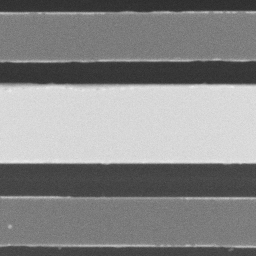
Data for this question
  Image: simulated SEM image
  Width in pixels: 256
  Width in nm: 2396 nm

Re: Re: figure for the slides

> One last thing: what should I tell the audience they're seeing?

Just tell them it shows lines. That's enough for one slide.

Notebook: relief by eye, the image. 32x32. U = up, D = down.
DDDDDDDDDDDDDDDDDDDDDDDDDDDDDDDD
DDDDDDDDDDDDDDDUUDDUUUUUUUUUUUUU
UUUUUUUUUUUUUUUUUUUUUUUUUUUUUUUU
UUUUUUUUUUUUUUUUUUUUUUUUUUUUUUUU
UUUUUUUUUUUUUUUUUUUUUUUUUUUUUUUU
UUUUUUUUUUUUUUUUUUUUUUUUUUUUUUUU
UUUUUUUUUUUUUUUUUUUUUUUUUUUUUUUU
UUUUUUUUUUUUUUUUUUUUUUUUUUUUUUUU
DDDDDDDDDDDDDDDDDDDDDDDDDDDDDDDD
DDDDDDDDDDDDDDDDDDDDDDDDDDDDDDDD
DDDDDDDDDDDDDDDDDDDDDDDDDDDDDDDD
UUUUUUUUUUUUUUUUUUUUUUUUUUUUUUUU
UUUUUUUUUUUUUUUUUUUUUUUUUUUUUUUU
UUUUUUUUUUUUUUUUUUUUUUUUUUUUUUUU
UUUUUUUUUUUUUUUUUUUUUUUUUUUUUUUU
UUUUUUUUUUUUUUUUUUUUUUUUUUUUUUUU
UUUUUUUUUUUUUUUUUUUUUUUUUUUUUUUU
UUUUUUUUUUUUUUUUUUUUUUUUUUUUUUUU
UUUUUUUUUUUUUUUUUUUUUUUUUUUUUUUU
UUUUUUUUUUUUUUUUUUUUUUUUUUUUUUUU
DDDDDDDDDDDDDDDDDDDDDDDDDDDDDDDD
DDDDDDDDDDDDDDDDDDDDDDDDDDDDDDDD
DDDDDDDDDDDDDDDDDDDDDDDDDDDDDDDD
DDDDDDDDDDDDDDDDDDDDDDDDDDDDDDDD
DDDDDDDDDDDDDDDDDDDDDDDDDDDDDDDD
UUUUUUUUUUUUUUUUUUUUUUUUUUUUUUUU
UUUUUUUUUUUUUUUUUUUUUUUUUUUUUUUU
UUUUUUUUUUUUUUUUUUUUUUUUUUUUUUUU
UUUUUUUUUUUUUUUUUUUUUUUUUUUUUUUU
UUUUUUUUUUUUUUUUUUUUUUUUUUUUUUUU
UUUUUUUUUUUUUUUUUUUUUUUUUUUUUUUU
DDDDDDDDDDDDDDDDDDDDDDDDDDDDDDDD